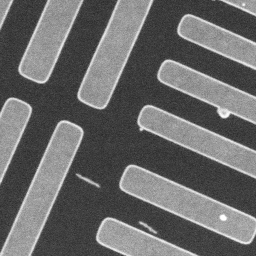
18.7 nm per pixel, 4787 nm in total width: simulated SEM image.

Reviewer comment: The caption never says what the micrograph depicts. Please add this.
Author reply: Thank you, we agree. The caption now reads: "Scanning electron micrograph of groups of lines, slits or small figures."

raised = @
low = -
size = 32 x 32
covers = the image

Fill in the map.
@-----@@@@-----@@@@----------@@@
@----@@@@@----@@@@-------------@
-----@@@@-----@@@@-----@@-------
-----@@@@----@@@@@----@@@@@@----
----@@@@-----@@@@------@@@@@@@--
----@@@@----@@@@@--------@@@@@@@
---@@@@-----@@@@-----------@@@@@
---@@@@-----@@@@-------------@@@
--@@@@@----@@@@-----@@@@--------
---@@@-----@@@@-----@@@@@@------
----------@@@@@------@@@@@@@----
----------@@@@---------@@@@@@@--
-@--------@@@@-----------@@@@@@@
@@@@--------@-----@@-------@@@@@
@@@@-------------@@@@@--------@@
@@@----@@--------@@@@@@@--------
@@@----@@@---------@@@@@@@------
@@----@@@@-----------@@@@@@@@---
@@----@@@@-------------@@@@@@@@-
@@---@@@@-----------------@@@@@@
@----@@@@-------------------@@@@
@----@@@--------@@@-----------@@
----@@@@-------@@@@@@-----------
----@@@--------@@@@@@@@---------
---@@@@----------@@@@@@@@@------
---@@@@------------@@@@@@@@@----
--@@@@---------------@@@@@@@@@--
--@@@@-------@@---------@@@@@@@@
--@@@-------@@@@@---------@@@@@@
-@@@@-------@@@@@@@---------@@@@
-@@@---------@@@@@@@@-----------
@@@@-----------@@@@@@@@@--------